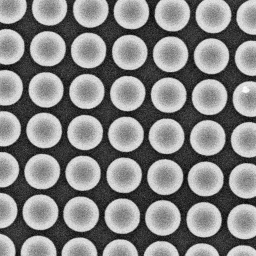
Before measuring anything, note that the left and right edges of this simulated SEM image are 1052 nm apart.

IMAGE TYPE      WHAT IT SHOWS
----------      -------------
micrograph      an array of small figures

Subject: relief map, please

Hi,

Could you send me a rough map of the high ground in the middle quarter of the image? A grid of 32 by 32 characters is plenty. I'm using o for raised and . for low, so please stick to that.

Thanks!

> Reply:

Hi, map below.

....oooo......ooooo....ooooooo..
.........................oooo...
................................
...ooooo......oooo........o.....
..ooooooo....oooooo....oooooo...
..oooooooo..oooooooo..oooooooo..
..oooooooo..oooooooo..oooooooo..
.ooooooooo..oooooooo..oooooooo..
..oooooooo..oooooooo..oooooooo..
..ooooooo...oooooooo..oooooooo..
...ooooo.....oooooo....ooooooo..
...............oo.......ooooo...
................................
...ooooo......ooo...............
..ooooooo...ooooooo....ooooo....
.oooooooo...ooooooo...ooooooo...
.ooooooooo.ooooooooo..oooooooo..
.ooooooooo.ooooooooo.ooooooooo..
.oooooooo..ooooooooo.ooooooooo..
..ooooooo...ooooooo...oooooooo..
..oooooo....ooooooo...ooooooo...
.............oooo......ooooo....
................................
...oooo.........................
.ooooooo....oooooo.....ooooo....
.oooooooo..oooooooo...ooooooo...
ooooooooo..oooooooo..oooooooo...
ooooooooo..oooooooo..ooooooooo.o
.oooooooo..oooooooo..ooooooooo.o
.oooooooo..oooooooo..ooooooooo.o
..oooooo....oooooo...oooooooo..o
....oo.......oooo.....oooooo....